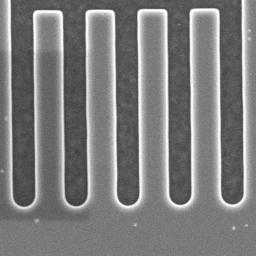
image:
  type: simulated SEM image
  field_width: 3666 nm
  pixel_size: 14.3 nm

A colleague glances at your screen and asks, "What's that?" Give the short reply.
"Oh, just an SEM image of groups of lines, slits or small figures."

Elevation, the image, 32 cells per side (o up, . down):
o.............................oo
o....oo....ooo....ooo...ooo...oo
o...oooo...ooo...oooo...ooo...oo
o...oooo...ooo...oooo...ooo...oo
o...oooo...ooo...oooo...ooo...oo
o...oooo...ooo...oooo...ooo...oo
o...oooo...ooo...oooo...ooo...oo
o...oooo...ooo...oooo...ooo...oo
o...oooo...ooo...oooo...ooo...oo
o...oooo...ooo...oooo...ooo....o
o...oooo...ooo...oooo...ooo....o
o...oooo...ooo...oooo...ooo....o
o...oooo...ooo...oooo...ooo....o
o...oooo...ooo...oooo...ooo....o
o...oooo...ooo...oooo...ooo....o
o...oooo...ooo...oooo...ooo....o
o...oooo...ooo...oooo...ooo....o
o...oooo...ooo....ooo...ooo....o
o...oooo...ooo....ooo...oooo...o
o...oooo...ooo....ooo...oooo...o
o...oooo...ooo....ooo...oooo...o
o...oooo...ooo....ooo...oooo...o
o...oooo...ooo....ooo...oooo...o
o...oooo...ooo....ooo...oooo...o
oo..oooo...oooo..oooo...oooo..oo
oo..ooooo.ooooo..ooooo.ooooo..oo
oooooooooooooooooooooooooooooooo
oooooooooooooooooooooooooooooooo
oooooooooooooooooooooooooooooooo
oooooooooooooooooooooooooooooooo
oooooooooooooooooooooooooooooooo
oooooooooooooooooooooooooooooooo